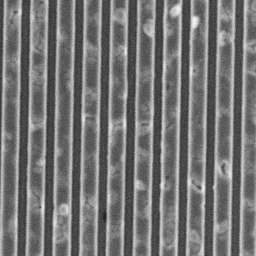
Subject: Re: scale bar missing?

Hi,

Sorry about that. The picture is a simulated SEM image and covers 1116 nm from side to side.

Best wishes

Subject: parallel lines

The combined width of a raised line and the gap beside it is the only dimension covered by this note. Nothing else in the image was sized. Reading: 26.7 pixels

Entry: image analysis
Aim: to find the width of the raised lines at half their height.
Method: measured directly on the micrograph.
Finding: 17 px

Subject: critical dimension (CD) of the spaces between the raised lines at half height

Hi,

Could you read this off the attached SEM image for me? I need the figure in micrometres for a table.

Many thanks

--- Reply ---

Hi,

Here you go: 0.0392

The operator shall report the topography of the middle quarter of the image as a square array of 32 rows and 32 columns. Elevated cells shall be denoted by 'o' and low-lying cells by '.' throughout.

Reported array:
oo...oooo..ooooo..oooo...oooo...
oo...oooo...oooo..oooo...oooo...
oo...oooo...oooo..oooo...oooo...
oo...oooo...oooo..oooo...oooo...
oo...oooo...oooo..oooo...oooo...
oo...oooo...oooo..oooo...oooo..o
oo...oooo...oooo..oooo...oooo..o
oo...oooo...oooo..oooo...oooo..o
oo...oooo...oooo..oooo..ooooo..o
oo...oooo..oooo...oooo...oooo..o
oo...oooo..oooo...oooo...oooo..o
oo...oooo..oooo...oooo...oooo..o
oo...oooo..oooo...oooo...oooo..o
oo....ooo..oooo...oooo...oooo..o
oo...oooo..ooo....oooo...oooo..o
oo...oooo..oooo...oooo...oooo..o
oo...oooo..oooo...oooo...oooo..o
oo...oooo..oooo...oooo..ooooo..o
oo...oooo..oooo...oooo...oooo..o
oo...oooo..oooo...oooo..ooooo..o
oo...oooo..oooo...oooo..ooooo..o
oo...oooo..oooo...oooo..ooooo..o
oo...oooo..oooo...oooo..ooooo..o
oo...oooo..oooo...oooo..ooooo..o
oo..oooo...oooo...oooo..ooooo..o
oo..oooo...oooo...oooo..ooooo..o
oo..oooo...oooo...oooo..ooooo..o
oo..oooo...oooo...oooo..ooooo..o
oo..oooo...oooo...oooo..ooooo..o
oo..oooo...oooo...oooo..ooooo..o
oo..oooo...oooo...oooo..ooooo..o
oo..oooo...oooo...oooo..ooooo..o